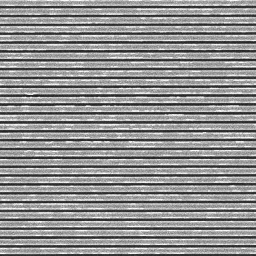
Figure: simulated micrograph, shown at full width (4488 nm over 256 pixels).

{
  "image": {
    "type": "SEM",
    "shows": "parallel lines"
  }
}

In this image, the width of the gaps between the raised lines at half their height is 50.4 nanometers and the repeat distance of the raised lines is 0.155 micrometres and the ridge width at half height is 0.105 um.